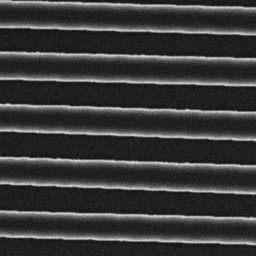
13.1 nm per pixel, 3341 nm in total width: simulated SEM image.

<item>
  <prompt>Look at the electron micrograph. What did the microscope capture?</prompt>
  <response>lines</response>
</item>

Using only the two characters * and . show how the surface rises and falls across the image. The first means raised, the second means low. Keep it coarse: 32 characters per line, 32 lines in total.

***************.................
********************************
********************************
...*****************************
................................
................................
................................
********************************
********************************
********************************
........................********
................................
................................
************....................
********************************
********************************
....****************************
...............................*
................................
................................
**********************.*........
********************************
********************************
...............*****************
................................
................................
***.............................
********************************
********************************
********************************
..............................**
................................